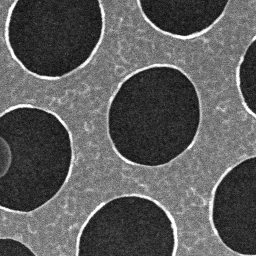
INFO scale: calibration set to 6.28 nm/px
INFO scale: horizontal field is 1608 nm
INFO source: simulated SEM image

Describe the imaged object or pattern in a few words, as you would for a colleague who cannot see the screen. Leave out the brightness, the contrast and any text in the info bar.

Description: holes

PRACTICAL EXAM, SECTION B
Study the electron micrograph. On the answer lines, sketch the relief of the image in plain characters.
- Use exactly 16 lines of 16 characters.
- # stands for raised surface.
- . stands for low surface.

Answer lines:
#.....###.....##
#.....####...###
#.....##########
#.....#########.
##..#####..####.
#######.....###.
#######.....###.
....###.....####
....###.....####
....###....#####
....###########.
....##########..
...####..####...
######....###...
#####......###..
..###......###..